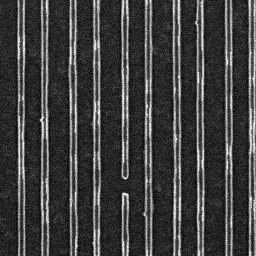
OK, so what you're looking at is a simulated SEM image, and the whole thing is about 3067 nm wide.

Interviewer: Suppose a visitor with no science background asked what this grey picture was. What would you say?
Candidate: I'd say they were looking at parallel lines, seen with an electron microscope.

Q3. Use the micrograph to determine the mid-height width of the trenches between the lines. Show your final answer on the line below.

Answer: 18.4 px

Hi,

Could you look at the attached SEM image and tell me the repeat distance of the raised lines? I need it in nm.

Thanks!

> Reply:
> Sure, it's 309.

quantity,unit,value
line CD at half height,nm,62.9